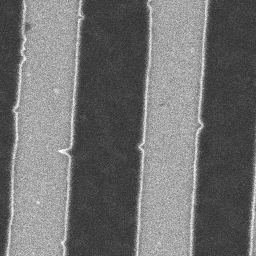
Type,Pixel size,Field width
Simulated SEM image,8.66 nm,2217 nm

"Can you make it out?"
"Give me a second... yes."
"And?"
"one or a few lines or trenches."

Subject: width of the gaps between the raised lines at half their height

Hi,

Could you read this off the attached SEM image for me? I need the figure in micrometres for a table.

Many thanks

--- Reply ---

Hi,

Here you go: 0.463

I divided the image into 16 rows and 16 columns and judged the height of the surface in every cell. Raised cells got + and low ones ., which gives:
++...++++....+++
+....++++....+++
++...++++....+++
+....++++....+++
+....++++....+++
+....++++....+++
+....++++...++++
+...+++++...++++
+...+++++...++++
+...+++++...++++
+...+++++...++++
+...+++++...++++
+...+++++...++++
+...+++++...++++
+...+++++...++++
+...+++++...++++